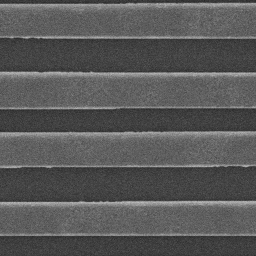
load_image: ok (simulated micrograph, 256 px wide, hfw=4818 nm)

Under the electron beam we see lines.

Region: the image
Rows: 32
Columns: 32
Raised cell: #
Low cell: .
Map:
................................
################################
################################
################################
################################
................................
................................
................................
................................
################################
################################
################################
################################
###############.................
................................
................................
................................
################################
################################
################################
################################
................................
................................
................................
................................
################################
################################
################################
################################
................................
................................
................................